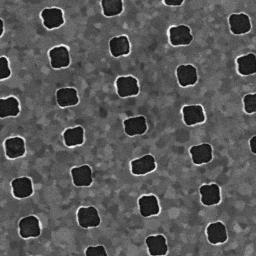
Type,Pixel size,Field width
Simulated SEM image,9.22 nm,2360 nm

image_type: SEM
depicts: a regular array of holes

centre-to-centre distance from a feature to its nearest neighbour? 370 nanometres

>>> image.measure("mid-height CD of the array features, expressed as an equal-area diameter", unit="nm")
201